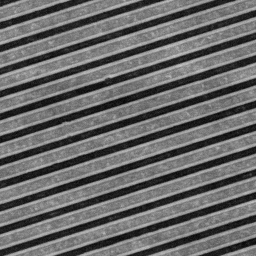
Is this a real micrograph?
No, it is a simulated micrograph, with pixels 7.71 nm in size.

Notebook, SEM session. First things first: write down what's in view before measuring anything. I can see parallel lines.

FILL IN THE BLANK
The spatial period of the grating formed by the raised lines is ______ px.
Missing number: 21.7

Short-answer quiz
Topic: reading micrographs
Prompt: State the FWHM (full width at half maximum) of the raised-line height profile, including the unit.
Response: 93.7 nanometres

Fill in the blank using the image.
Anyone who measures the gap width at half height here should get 73.6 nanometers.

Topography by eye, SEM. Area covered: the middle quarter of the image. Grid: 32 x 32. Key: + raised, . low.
++........++++++++++........++++
.......++++++++++........+++++++
....++++++++++........++++++++++
.+++++++++.........++++++++++...
++++++++........++++++++++......
+++++........++++++++++.......++
++.......+++++++++++.......+++++
......++++++++++........++++++++
...++++++++++........++++++++++.
++++++++++.......+++++++++++....
+++++++.......+++++++++++.......
++++.......+++++++++++.......+++
+.......+++++++++++.......++++++
.....++++++++++........+++++++++
..++++++++++........++++++++++..
+++++++++.......+++++++++++.....
++++++.......+++++++++++.......+
+++.......+++++++++++.......++++
.......+++++++++++.......+++++++
....+++++++++++.......++++++++++
.++++++++++........++++++++++...
++++++++.......+++++++++++......
+++++.......+++++++++++.......++
++.......+++++++++++.......+++++
......+++++++++++.......++++++++
...++++++++++........++++++++++.
++++++++++........++++++++++....
+++++++........++++++++++.......
++++.......+++++++++++.......+++
+.......++++++++++........++++++
.....++++++++++........+++++++++
..++++++++++........++++++++++..